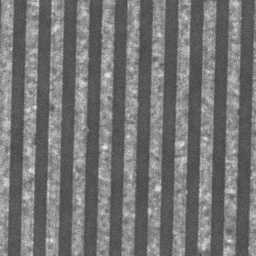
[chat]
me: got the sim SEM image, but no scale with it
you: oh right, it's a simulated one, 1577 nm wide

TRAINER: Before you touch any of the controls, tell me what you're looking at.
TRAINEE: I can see parallel lines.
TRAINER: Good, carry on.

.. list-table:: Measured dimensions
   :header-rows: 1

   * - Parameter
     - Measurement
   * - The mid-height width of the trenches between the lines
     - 85.4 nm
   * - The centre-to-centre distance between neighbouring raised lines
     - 156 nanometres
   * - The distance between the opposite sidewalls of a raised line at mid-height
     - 69.2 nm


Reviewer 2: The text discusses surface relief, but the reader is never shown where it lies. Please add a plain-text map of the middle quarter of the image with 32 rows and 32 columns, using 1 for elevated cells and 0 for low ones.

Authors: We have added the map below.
00011100001100001100001110000110
00011100001100001100001110000110
00011100011100001100001110000110
00011100011100001100001110001110
00011100011100001100001110001110
00011100011100001100001110000110
00011100011100001100001110001110
00011100011100001100001110001110
00011100011100001100001110001110
00011100011100001100001100001110
00011100011100001100001100001110
00011100011100001100001100001110
00011100011100001100001100001110
00011100011100001100001100001110
00011000011100011100001100001110
00011000011100011100001100001110
00011100011100011100001100001110
00011100011100011100001100001110
00011000011100011100001100001110
00011000011100011100001100001110
00011000011100011100001100001110
00011000011100011100001100001110
00011000011100011100001100001110
00011000011100011100001100001110
00011000011100011100001100001100
00011000011100011100001100001100
00011000011000011100011100001100
00011000011000011100011100001100
00011000011000011100011100001100
00011000011000011100011100001100
00011000011000011100011100001100
00111000011000011100011100001100